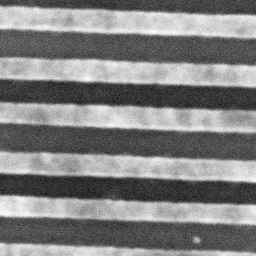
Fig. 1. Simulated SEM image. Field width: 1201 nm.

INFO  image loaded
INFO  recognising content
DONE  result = lines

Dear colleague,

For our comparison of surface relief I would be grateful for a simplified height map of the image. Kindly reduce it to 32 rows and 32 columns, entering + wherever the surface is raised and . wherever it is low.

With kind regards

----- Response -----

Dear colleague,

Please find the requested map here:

................................
+++++++++++++++.................
++++++++++++++++++++++++++++++++
..++++++++++++++++++++++++++++++
...........................+++++
................................
................................
++++++..........................
++++++++++++++++++++++++++++++++
++++++++++++++++++++++++++++++++
.......................+++++++++
................................
................................
++++++++++++++++++..............
++++++++++++++++++++++++++++++++
......++++++++++++++++++++++++++
..............................++
................................
................................
++++++++++++++..................
++++++++++++++++++++++++++++++++
++++++++++++++++++++++++++++++++
............................++++
................................
................................
++++++++++++++++++++++..........
++++++++++++++++++++++++++++++++
...................+++++++++++++
................................
................................
................................
++++++++++++++++++++++++++++....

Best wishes